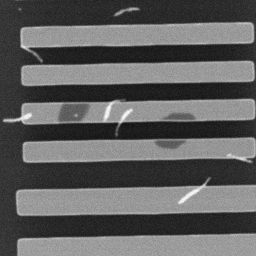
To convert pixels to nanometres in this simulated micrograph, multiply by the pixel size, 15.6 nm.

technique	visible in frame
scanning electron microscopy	groups of lines, slits or small figures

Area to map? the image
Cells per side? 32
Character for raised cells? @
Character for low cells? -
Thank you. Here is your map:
--------------------------------
--------------------------------
--------------------------------
---@@@@@@@@@@@@@@@@@@@@@@@@@@@@@
---@@@@@@@@@@@@@@@@@@@@@@@@@@@@@
---@@@@@@@@@@@@@@@@@------------
--------------------------------
--------------------------------
---@@@@@@@@@@@@@@@@@@@@@@@@@@@@@
---@@@@@@@@@@@@@@@@@@@@@@@@@@@@@
---@@@@@------------------------
--------------------------------
----------------------------@@@-
---@@@@@@@@@@@@@@@@@@@@@@@@@@@@@
---@@@@@@@@@@@@@@@@@@@@@@@@@@@@@
--------------------------------
--------------------------------
------------------@@@@@@@@@@@@@@
---@@@@@@@@@@@@@@@@@@@@@@@@@@@@@
---@@@@@@@@@@@@@@@@@@@@@@@@@@@@@
--------------------------------
--------------------------------
--------------------------------
-----------------@@@@@@@@@@@@@@@
--@@@@@@@@@@@@@@@@@@@@@@@@@@@@@@
--@@@@@@@@@@@@@@@@@@@@@@@@@@@@@@
--@@@@@@@@@@@@@@@@@@@@@@@-------
--------------------------------
--------------------------------
----------------------@@@@@@@@@@
--@@@@@@@@@@@@@@@@@@@@@@@@@@@@@@
--@@@@@@@@@@@@@@@@@@@@@@@@@@@@@@